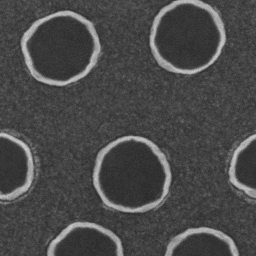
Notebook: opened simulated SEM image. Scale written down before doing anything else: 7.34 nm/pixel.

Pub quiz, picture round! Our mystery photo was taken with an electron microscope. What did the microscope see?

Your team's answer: raised bodies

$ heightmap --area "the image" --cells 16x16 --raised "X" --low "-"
----------XXX---
--XXX-----XXXX--
--XXXX----XXXX--
--XXXX----XXXX--
--XXX-----------
----------------
----------------
----------------
----------------
XX-----XXX-----X
XX----XXXX----XX
XX----XXXX-----X
-------XXX------
----------------
----XXX-----X---
---XXXX----XXXX-